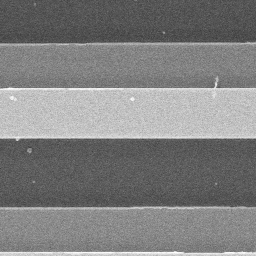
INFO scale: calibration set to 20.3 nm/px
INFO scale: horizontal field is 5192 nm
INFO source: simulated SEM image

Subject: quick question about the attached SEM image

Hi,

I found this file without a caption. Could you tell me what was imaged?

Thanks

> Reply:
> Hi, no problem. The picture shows lines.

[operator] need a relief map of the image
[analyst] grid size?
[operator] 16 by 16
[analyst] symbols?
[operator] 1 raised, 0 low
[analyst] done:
0000000000000000
0000000000000000
0000000000000000
1111111111111111
1111111111111111
1111111111111111
1111111111111111
1111111111111111
1111111111111111
0000000000000000
0000000000000000
0000000000000000
0000000000000000
1111111111111111
1111111111111111
1111111111111111